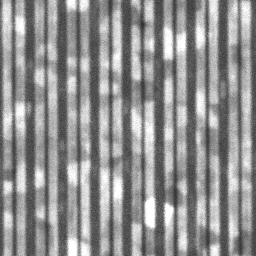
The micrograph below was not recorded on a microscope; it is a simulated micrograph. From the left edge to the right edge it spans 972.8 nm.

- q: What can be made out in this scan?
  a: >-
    parallel lines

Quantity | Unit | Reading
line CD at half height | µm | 0.0295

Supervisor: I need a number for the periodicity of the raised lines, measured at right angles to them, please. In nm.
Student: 60.4